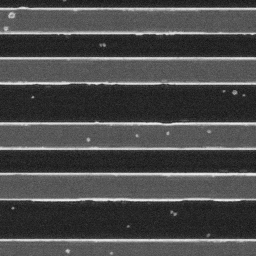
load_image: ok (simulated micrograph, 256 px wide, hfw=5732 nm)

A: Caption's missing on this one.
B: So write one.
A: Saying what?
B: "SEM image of lines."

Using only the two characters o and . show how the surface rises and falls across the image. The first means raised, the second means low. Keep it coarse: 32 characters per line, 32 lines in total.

................................
oooooooooooooooooooooooooooooooo
oooooooooooooooooooooooooooooooo
oooooooooooooooooooooooooooooooo
................................
................................
................................
oooooooooooooooooooooooooooooooo
oooooooooooooooooooooooooooooooo
oooooooooooooooooooooooooooooooo
................................
................................
................................
................................
................................
oooooooooooooooooooo.ooooooooooo
oooooooooooooooooooooooooooooooo
oooooooooooooooooooooooooooooooo
oooooooooooooooooooooooooooooooo
................................
................................
................................
oooooooooooooooooooooooooooooooo
oooooooooooooooooooooooooooooooo
oooooooooooooooooooooooooooooooo
................................
................................
................................
................................
................................
oooooooooooooooooooooooooooooooo
oooooooooooooooooooooooooooooooo